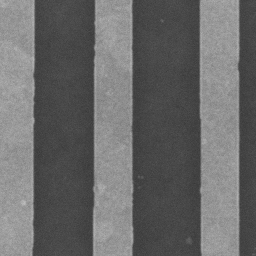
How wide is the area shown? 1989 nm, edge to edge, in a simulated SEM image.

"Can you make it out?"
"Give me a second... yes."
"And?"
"lines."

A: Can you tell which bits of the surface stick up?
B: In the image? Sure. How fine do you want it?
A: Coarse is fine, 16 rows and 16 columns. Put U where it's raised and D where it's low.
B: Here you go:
UUDDDDUUDDDDDUUD
UUDDDDUUDDDDDUUD
UUDDDDUUDDDDDUUD
UUDDDDUUDDDDDUUD
UUDDDDUUDDDDDUUD
UUDDDDUUDDDDDUUD
UUDDDDUUDDDDDUUD
UUDDDDUUDDDDDUUD
UUDDDDUUDDDDDUUD
UUDDDDUUDDDDDUUD
UUDDDDUUDDDDDUUD
UUDDDDUUDDDDDUUD
UUDDDDUUDDDDDUUD
UUDDDDUUDDDDDUUD
UUDDDDUUDDDDDUUD
UUDDDDUUDDDDDUUD